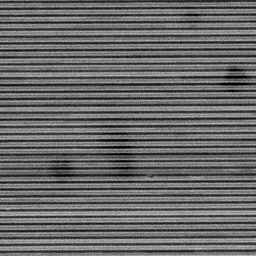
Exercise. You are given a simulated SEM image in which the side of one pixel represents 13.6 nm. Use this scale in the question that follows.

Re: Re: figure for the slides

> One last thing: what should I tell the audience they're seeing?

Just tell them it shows parallel lines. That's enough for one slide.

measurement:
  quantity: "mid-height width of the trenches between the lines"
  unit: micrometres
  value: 0.0475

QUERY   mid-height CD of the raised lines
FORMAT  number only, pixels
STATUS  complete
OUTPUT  3.5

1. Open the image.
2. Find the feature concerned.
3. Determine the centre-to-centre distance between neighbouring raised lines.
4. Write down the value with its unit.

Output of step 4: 94.2 nanometres